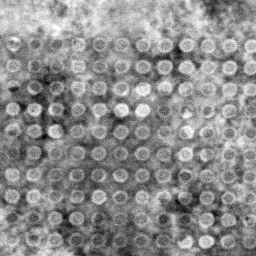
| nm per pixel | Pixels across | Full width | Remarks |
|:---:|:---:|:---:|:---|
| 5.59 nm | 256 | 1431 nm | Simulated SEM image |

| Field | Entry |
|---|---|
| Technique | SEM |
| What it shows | a regular array of raised bodies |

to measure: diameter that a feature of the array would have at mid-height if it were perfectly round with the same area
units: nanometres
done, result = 72.2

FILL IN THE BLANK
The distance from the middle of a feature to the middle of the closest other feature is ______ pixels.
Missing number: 21.4